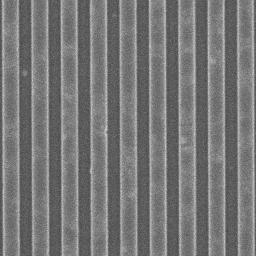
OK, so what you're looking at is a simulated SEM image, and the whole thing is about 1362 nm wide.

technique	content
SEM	parallel lines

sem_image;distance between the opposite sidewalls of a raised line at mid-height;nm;83.4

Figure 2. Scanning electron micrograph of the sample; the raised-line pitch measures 0.156 micrometres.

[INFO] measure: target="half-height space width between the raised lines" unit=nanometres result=69.1